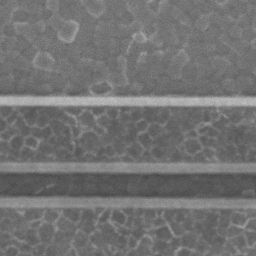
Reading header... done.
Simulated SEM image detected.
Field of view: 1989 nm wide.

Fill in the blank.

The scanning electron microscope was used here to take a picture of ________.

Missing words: one or a few lines or trenches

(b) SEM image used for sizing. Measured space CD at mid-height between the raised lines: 271 nm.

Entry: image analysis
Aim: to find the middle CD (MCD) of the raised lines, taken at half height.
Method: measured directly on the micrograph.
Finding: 521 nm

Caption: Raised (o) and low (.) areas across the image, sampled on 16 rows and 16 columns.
................
................
................
................
................
................
oooooooooooooooo
oooooooooooooooo
oooooooooooooooo
oooooooooooooooo
.......o........
................
................
oooooooooooooooo
oooooooooooooooo
oooooooooooooooo